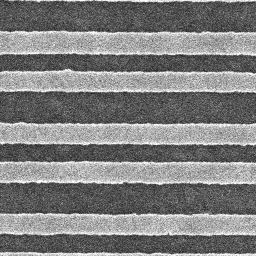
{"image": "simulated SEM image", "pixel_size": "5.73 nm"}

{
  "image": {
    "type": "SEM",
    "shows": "parallel lines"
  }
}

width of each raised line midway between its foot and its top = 115 nm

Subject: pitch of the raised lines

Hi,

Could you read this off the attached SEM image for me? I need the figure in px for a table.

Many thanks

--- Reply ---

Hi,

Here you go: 45.4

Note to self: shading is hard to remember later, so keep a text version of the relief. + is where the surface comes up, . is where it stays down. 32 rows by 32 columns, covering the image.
................................
................................
................................
................................
++++++++++++++++++++++++++++++++
++++++++++++++++++++++++++++++++
++++++++++++++++++++++++++++++++
................................
................................
++++++++++++++++++++++++++++++++
++++++++++++++++++++++++++++++++
...................+++.++..++...
................................
.......+........................
................................
+++++..........+..+...++++..+..+
++++++++++++++++++++++++++++++++
++++++++++++++++++++++++++++++++
.......+........................
......................+.++......
++++++++++++++++++++++++++++++++
++++++++++++++++++++++++++++++++
++++++++++++++++++++++++++++++++
................................
................................
................................
................................
++++++++++++++++++++++++++++++++
++++++++++++++++++++++++++++++++
................................
................................
................................